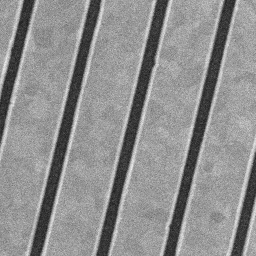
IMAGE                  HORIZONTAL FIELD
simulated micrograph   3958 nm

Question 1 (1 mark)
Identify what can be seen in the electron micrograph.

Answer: one or a few lines or trenches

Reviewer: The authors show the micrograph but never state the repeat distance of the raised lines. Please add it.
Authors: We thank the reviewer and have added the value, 1010 nanometers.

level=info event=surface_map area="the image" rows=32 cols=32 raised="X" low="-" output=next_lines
XXX--XXXXXX--XXXXXX--XXXXXXX--XX
XX--XXXXXXX--XXXXXX--XXXXXX--XXX
XX--XXXXXX--XXXXXXX--XXXXXX--XXX
XX--XXXXXX--XXXXXXX--XXXXXX--XXX
XX--XXXXXX--XXXXXX--XXXXXXX--XXX
X--XXXXXXX--XXXXXX--XXXXXX--XXXX
X--XXXXXXX-XXXXXXX--XXXXXX--XXXX
X--XXXXXX--XXXXXXX--XXXXXX--XXXX
X--XXXXXX--XXXXXX--XXXXXXX--XXXX
--XXXXXXX--XXXXXX--XXXXXX--XXXXX
--XXXXXXX--XXXXXX--XXXXXX--XXXXX
--XXXXXX--XXXXXXX--XXXXXX--XXXXX
--XXXXXX--XXXXXX--XXXXXXX--XXXXX
-XXXXXXX--XXXXXX--XXXXXXX--XXXXX
-XXXXXXX--XXXXXX--XXXXXX--XXXXXX
-XXXXXX--XXXXXXX--XXXXXX--XXXXXX
-XXXXXX--XXXXXX--XXXXXXX--XXXXXX
XXXXXXX--XXXXXX--XXXXXXX-XXXXXXX
XXXXXXX--XXXXXX--XXXXXX--XXXXXXX
XXXXXX--XXXXXXX--XXXXXX--XXXXXX-
XXXXXX--XXXXXXX-XXXXXXX--XXXXXX-
XXXXXX--XXXXXX--XXXXXXX--XXXXXX-
XXXXXX--XXXXXX--XXXXXX--XXXXXXX-
XXXXX--XXXXXXX--XXXXXX--XXXXXXX-
XXXXX--XXXXXXX-XXXXXXX--XXXXXX--
XXXXX--XXXXXX--XXXXXXX--XXXXXX--
XXXXX--XXXXXX--XXXXXX--XXXXXXX--
XXXX--XXXXXXX--XXXXXX--XXXXXXX--
XXXX--XXXXXX---XXXXXX--XXXXXX--X
XXXX--XXXXXX--XXXXXXX--XXXXXX--X
XXXX--XXXXXX--XXXXXXX-XXXXXXX--X
XXX---XXXXXX--XXXXXX--XXXXXXX--X